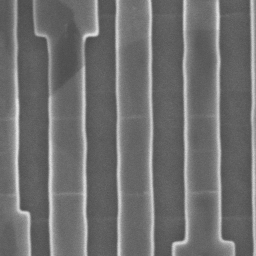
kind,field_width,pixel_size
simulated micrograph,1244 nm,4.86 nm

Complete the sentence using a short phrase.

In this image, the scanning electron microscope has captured wiring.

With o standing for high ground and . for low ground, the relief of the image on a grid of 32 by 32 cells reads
oo..oooooooo...oooo....oooo....o
oo..oooooooo...oooo....oooo.....
oo..oooooooo...oooo....oooo.....
oo..oooooooo...oooo....oooo.....
oo....ooooo....oooo....oooo.....
oo....oooo.....oooo....oooo.....
oo....oooo.....oooo....oooo.....
oo....oooo.....oooo....oooo.....
oo....oooo.....oooo....oooo.....
oo....oooo.....oooo....oooo.....
oo....oooo.....oooo....oooo.....
oo....oooo.....oooo....oooo.....
oo....oooo.....oooo....oooo.....
oo....oooo.....oooo....oooo.....
oo....oooo.....oooo....oooo.....
oo....oooo.....oooo....oooo.....
oo....ooooo....oooo....oooo.....
oo....ooooo....oooo....oooo.....
oo....ooooo....oooo....oooo.....
oo....ooooo....oooo....oooo.....
oo....ooooo....oooo....oooo.....
oo....ooooo....oooo....oooo.....
oo....ooooo....oooo....oooo.....
oo....ooooo....oooo....oooo.....
oo....ooooo....oooo....oooo.....
oo....ooooo....oooo....oooo.....
ooo...ooooo....oooo....oooo.....
oooo..ooooo....oooo....oooo.....
oooo..ooooo....oooo....oooo.....
oooo..ooooo....oooo....ooooo....
oooo..ooooo....oooo...ooooooo...
oooo...oooo....oooo...ooooooo...